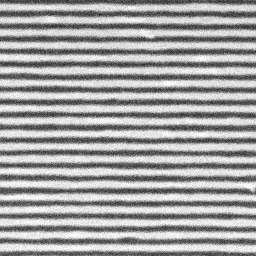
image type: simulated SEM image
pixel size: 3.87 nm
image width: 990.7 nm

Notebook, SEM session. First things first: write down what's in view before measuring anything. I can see parallel lines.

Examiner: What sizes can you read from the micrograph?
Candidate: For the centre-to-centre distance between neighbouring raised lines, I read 48.9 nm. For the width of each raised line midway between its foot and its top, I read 0.0232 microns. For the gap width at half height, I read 0.0266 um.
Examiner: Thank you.